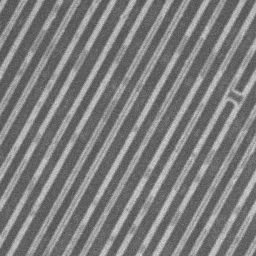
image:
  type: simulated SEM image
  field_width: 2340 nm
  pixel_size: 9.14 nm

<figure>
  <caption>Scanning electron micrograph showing parallel lines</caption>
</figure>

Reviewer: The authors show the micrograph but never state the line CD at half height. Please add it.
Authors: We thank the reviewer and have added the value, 41 nm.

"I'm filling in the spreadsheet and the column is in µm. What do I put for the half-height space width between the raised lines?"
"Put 0.0991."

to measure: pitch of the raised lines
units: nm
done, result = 146